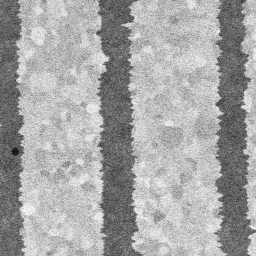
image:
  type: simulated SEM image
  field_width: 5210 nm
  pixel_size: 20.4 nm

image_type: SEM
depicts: one or a few lines or trenches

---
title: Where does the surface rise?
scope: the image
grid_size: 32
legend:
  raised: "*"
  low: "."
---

..**********.....**********....*
...*********....***********...**
...**********....**********....*
...*********....***********....*
...*********....***********....*
..***********...***********...**
..***********...************...*
..***********...***********....*
..***********...***********....*
..**********....***********....*
..**********....***********....*
...*********....***********....*
..**********....***********....*
..**********.....**********....*
...**********....**********....*
...**********...***********....*
...**********...***********....*
...*********.....**********....*
...*********.....**********....*
...**********....**********....*
...**********....**********....*
...**********....**********....*
...**********....**********....*
...**********....**********....*
...**********....**********....*
...*********.....***********...*
...**********....**********....*
...**********....***********...*
...**********....**********.....
...**********....**********....*
...**********....**********....*
...**********....***********...*